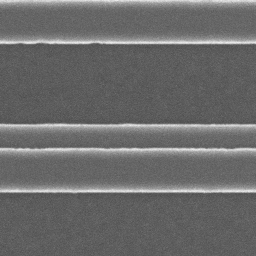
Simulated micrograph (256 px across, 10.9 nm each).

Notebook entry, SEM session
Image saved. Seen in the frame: lines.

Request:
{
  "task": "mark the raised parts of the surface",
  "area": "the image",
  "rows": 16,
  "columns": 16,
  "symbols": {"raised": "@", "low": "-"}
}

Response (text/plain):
@@@@@@@@@@@@@@@@
@@@@@@@@@@@@@@@@
@@@@@@@@@@@@@@@@
----------------
----------------
----------------
----------------
----------------
@@@@@@@@@@@@@@@@
@@@@@@@@@@@@@@@@
@@@@@@@@@@@@@@@@
@@@@@@@@@@@@@@@@
----------------
----------------
----------------
----------------